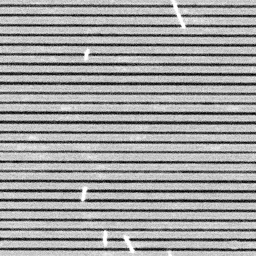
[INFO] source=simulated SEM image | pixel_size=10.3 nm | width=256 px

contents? parallel lines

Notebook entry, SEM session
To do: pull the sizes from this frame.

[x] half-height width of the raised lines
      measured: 68.1 nm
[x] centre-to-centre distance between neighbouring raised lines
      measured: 100 nm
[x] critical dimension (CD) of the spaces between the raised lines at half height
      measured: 0.0386 microns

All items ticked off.